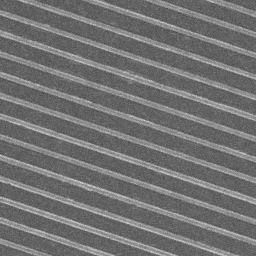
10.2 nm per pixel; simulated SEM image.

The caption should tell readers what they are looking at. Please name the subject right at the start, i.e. parallel lines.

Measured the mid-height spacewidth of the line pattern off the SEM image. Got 153 nanometers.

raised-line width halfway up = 47.4 nm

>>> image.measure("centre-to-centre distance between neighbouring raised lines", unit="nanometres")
202